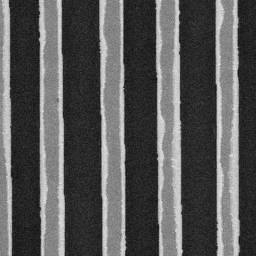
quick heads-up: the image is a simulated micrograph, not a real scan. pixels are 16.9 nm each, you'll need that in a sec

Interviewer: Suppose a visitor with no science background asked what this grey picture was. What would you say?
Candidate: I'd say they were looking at lines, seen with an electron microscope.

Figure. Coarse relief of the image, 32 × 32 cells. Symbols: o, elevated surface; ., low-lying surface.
o....ooo.....oo.....oo.....oo...
o....ooo.....oo.....oo.....oo...
o....ooo.....oo.....oo.....ooo..
o....ooo.....oo.....oo.....oo...
o....ooo.....oo.....oo.....oo...
o....ooo.....oo.....oo.....oo...
o....ooo.....oo.....oo.....oo...
o....ooo.....oo.....oo.....ooo..
o....ooo.....oo.....oo.....ooo..
o....ooo.....oo.....oo.....ooo..
o....ooo.....oo.....oo.....ooo..
o....ooo.....oo.....oo.....ooo..
o....ooo.....oo.....oo.....ooo..
o....ooo.....oo.....oo.....ooo..
o....ooo.....oo.....oo.....ooo..
o....ooo.....oo.....oo.....oo...
o....ooo.....oo.....oo.....oo...
o....ooo.....oo.....oo.....oo...
o....ooo.....oo.....oo.....oo...
o....ooo.....oo.....oo.....oo...
o....ooo.....oo.....oo.....oo...
o....ooo.....oo.....oo.....oo...
o....ooo.....oo.....oo.....oo...
o....ooo.....ooo....oo.....oo...
o....ooo.....oo.....oo.....oo...
o....ooo.....ooo....oo.....oo...
o....ooo.....ooo....oo.....oo...
o....ooo.....ooo....oo.....ooo..
o....ooo.....ooo....ooo....ooo..
o....ooo.....ooo....ooo....ooo..
o....ooo.....ooo....ooo....ooo..
o....ooo.....ooo....ooo....ooo..